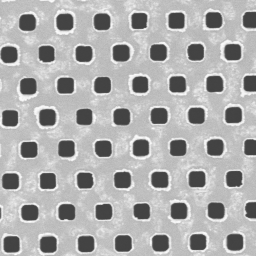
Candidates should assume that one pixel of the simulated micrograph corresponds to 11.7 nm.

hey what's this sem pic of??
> a regular array of holes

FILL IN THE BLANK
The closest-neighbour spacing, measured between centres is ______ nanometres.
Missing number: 428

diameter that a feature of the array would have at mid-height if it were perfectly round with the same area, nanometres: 208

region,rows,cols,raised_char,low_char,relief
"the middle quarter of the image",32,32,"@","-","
@@@@@@@@@@@@@@@@@@@@@@@@@@@@@@@@
@@@@@@@@@@@@@@@@@@@@@@@@@@@@@@@@
@@@@@@@@@@@@@@@@@@@@@@@@@@@@@@@@
--@@@@@@---@@@@@@@---@@@@@@---@@
---@@@@@----@@@@@----@@@@@----@@
---@@@@@----@@@@@----@@@@@----@@
--@@@@@@----@@@@@----@@@@@----@@
--@@@@@@@@@@@@@@@@@@@@@@@@@@@@@@
@@@@@@@@@@@@@@@@@@@@@@@@@@@@@@@@
@@@@@@@@@@@@@@@@@@@@@@@@@@@@@@@@
@@@@@@@@@@@@@@@@@@@@@@@@@@@@@@@@
@@@@---@@@@@@---@@@@@@----@@@@@-
@@@----@@@@@-----@@@@@----@@@@@-
@@@----@@@@@-----@@@@@----@@@@@-
@@@----@@@@@-----@@@@@----@@@@@-
@@@@@@@@@@@@@@@@@@@@@@@@@@@@@@@@
@@@@@@@@@@@@@@@@@@@@@@@@@@@@@@@@
@@@@@@@@@@@@@@@@@@@@@@@@@@@@@@@@
@@@@@@@@@@@@@@@@@@@@@@@@@@@@@@@@
--@@@@@@---@@@@@@----@@@@@@---@@
---@@@@@----@@@@@----@@@@@-----@
---@@@@@----@@@@@----@@@@@-----@
---@@@@@----@@@@@----@@@@@@---@@
@@@@@@@@@@@@@@@@@@@@@@@@@@@@@@@@
@@@@@@@@@@@@@@@@@@@@@@@@@@@@@@@@
@@@@@@@@@@@@@@@@@@@@@@@@@@@@@@@@
@@@@@@@@@@@@@@@@@@@@@@@@@@@@@@@@
@@@----@@@@@@---@@@@@@----@@@@@-
@@@----@@@@@-----@@@@@----@@@@@-
@@@----@@@@@-----@@@@@----@@@@@-
@@@----@@@@@@---@@@@@@----@@@@@-
@@@@@@@@@@@@@@@@@@@@@@@@@@@@@@@@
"